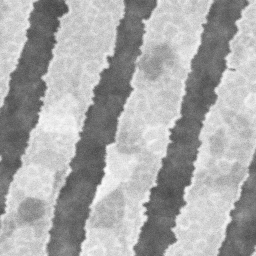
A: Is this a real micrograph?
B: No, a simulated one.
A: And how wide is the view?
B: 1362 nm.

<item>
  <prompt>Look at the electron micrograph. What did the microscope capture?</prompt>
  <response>one or a few lines or trenches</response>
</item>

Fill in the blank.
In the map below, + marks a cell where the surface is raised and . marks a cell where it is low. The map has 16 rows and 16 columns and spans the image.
++..++++..+++..+
++..+++..++++..+
++..+++..+++...+
+..++++..+++..++
+..+++..++++..++
...+++..++++..++
...+++..+++..+++
..+++...+++..+++
..+++..++++..+++
..+++..+++..++++
.+++...+++..+++.
.+++..++++..+++.
+++...+++...+++.
+++...+++..+++..
+++..++++..+++..
+++..+++...+++..